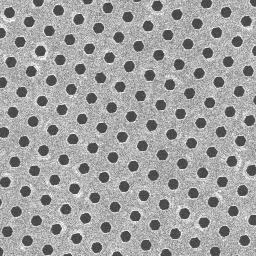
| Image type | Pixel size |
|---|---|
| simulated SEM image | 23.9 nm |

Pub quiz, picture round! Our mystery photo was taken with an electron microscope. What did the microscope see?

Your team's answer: a regular array of holes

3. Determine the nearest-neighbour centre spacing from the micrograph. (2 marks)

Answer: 519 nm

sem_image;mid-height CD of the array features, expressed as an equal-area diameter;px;11.2